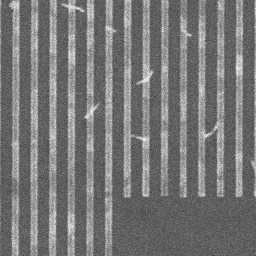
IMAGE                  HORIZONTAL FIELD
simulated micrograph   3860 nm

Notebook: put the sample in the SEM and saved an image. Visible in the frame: parallel lines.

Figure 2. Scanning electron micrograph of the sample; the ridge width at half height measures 73.5 nanometres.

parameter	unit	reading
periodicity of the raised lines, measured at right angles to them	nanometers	281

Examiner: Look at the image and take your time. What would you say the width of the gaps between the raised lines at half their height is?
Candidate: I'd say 13.6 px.